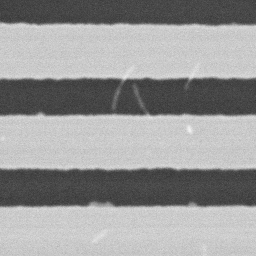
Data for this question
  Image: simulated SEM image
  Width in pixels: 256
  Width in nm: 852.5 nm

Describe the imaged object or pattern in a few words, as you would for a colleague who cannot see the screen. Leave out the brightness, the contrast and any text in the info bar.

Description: lines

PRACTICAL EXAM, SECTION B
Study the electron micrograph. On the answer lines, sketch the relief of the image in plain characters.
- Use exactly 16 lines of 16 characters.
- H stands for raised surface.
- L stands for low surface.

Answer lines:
LLLLLLLLLLLLLLLL
HHLLLLLLLLLLLLLL
HHHHHHHHHHHHHHHH
HHHHHHHHHHHHHHHH
HHHHHHHHHHHHHHHH
LLLLLLLLLLLLLLLL
LLLLLLLLLLLLLLLL
HHHHHHHHHHHHHHHH
HHHHHHHHHHHHHHHH
HHHHHHHHHHHHHHHH
HHHHHHHHHLLHHHHH
LLLLLLLLLLLLLLLL
LLLLLLLLLLLLLLLL
HHHHHHHHHHHHHHHH
HHHHHHHHHHHHHHHH
HHHHHHHHHHHHHHHH